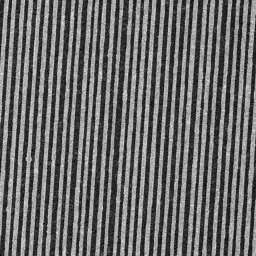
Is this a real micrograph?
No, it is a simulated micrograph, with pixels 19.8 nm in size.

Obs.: parallel lines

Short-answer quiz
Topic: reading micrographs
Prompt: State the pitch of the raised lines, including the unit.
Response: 163 nm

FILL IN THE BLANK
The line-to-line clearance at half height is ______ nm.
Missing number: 88.8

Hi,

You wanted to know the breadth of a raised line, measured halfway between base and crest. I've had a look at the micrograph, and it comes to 69.1 nanometres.